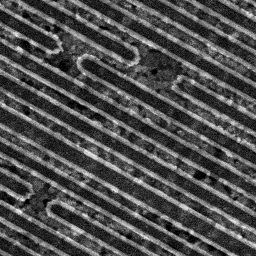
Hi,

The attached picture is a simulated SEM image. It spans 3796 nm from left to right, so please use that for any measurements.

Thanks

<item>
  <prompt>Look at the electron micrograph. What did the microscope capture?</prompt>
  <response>parallel lines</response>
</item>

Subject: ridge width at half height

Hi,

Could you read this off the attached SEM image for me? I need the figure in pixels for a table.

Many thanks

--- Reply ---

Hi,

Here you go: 13.7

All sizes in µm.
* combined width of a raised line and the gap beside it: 0.421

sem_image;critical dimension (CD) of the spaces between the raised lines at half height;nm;217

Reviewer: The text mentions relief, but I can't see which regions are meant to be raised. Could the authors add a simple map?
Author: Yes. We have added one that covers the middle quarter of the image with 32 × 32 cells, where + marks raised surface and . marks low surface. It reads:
++++......++++++++++++++++++++++
+++++.......++++++++++++++++++++
++++++........++++++++++++++++++
.+++++++........+++++++++++++.++
...+++++++........++++++++++....
.....+++++++.......+++++++++....
.......++++++........+++++++....
+.......+++++++........+++++++..
+++.......+++++++........+++++++
+++++.......+++++++.......++++++
++++++........+++++++.......++++
.+++++++.......+++++++........++
...+++++++.......+++++++........
.....+++++++.......+++++++......
......++++++++.......+++++++....
+.......+++++++........++++++...
+++.......+++++++.......+++++++.
++++........+++++++.......++++++
++++++.......++++++++.......++++
.+++++++.......++++++++.......++
..++++++++.......+++++++........
....++++++++.......+++++++......
......+++++++........+++++++....
........+++++++.......++++++++..
..........+++++++.......+++++++.
++.........++++++++.......++++++
++++.........+++++++........++++
++++++.........+++++++........++
..++++++.........+++++++.......+
...++++++..........+++++++......
.....++++++.........++++++++....
.......++++++.........+++++++...